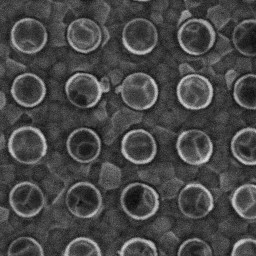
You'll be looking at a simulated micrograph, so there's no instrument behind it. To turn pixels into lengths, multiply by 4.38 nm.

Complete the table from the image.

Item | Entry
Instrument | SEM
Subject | a regular array of raised bodies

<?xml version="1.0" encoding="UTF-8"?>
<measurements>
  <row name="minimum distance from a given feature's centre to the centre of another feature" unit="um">0.237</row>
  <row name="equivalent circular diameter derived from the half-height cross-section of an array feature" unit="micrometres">0.149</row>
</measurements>